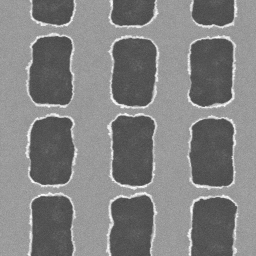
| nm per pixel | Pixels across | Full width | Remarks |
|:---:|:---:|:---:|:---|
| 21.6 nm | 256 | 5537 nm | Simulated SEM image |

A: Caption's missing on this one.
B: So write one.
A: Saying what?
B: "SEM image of holes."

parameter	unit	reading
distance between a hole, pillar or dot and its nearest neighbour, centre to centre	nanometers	1700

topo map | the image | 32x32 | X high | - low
XXXX-----XXXXX-----XXXXX-----XXX
XXXX-----XXXXX-----XXXXX-----XXX
XXXXX----XXXXX-----XXXXX-----XXX
XXXXXXXXXXXXXXXXXXXXXXXXXXXXXXXX
XXXXXXXXXXXXXXXXXXXXXXXXXXXXXXXX
XXXX-----XXXXX-----XXXXX-----XXX
XXXX-----XXXXX------XXXX-----XXX
XXXX-----XXXXX------XXXX-----XXX
XXXX-----XXXXX------XXXX-----XXX
XXXX-----XXXXX-----XXXXX-----XXX
XXX------XXXXX-----XXXXX-----XXX
XXXX-----XXXXX-----XXXXX-----XXX
XXXX-----XXXXX-----XXXXX-----XXX
XXXXXXXXXXXXXXXXXXXXXXXXXXXXXXXX
XXXXXX-XXXXXXXX-X-XXXXXXXXXXXXXX
XXXX-----XXXXX-----XXXXX-----XXX
XXXX-----XXXXX-----XXXXX-----XXX
XXXX-----XXXXX-----XXXXX-----XXX
XXXX-----XXXXX-----XXXXX-----XXX
XXXX-----XXXXX-----XXXXX-----XXX
XXXX-----XXXXX-----XXXXX-----XXX
XXXX-----XXXXX-----XXXXX-----XXX
XXXX-----XXXXX-----XXXXX-----XXX
XXXXXXXXXXXXXXXXXXXXXXXXXXXXXXXX
XXXXX---XXXXXXXXX-XXXXXXXXXXXXXX
XXXX-----XXXXX-----XXXXX-----XXX
XXXX-----XXXXX-----XXXXX------XX
XXXX-----XXXXX-----XXXXX-----XXX
XXXX-----XXXXX-----XXXXX-----XXX
XXXX-----XXXXX-----XXXXX-----XXX
XXXX-----XXXXX-----XXXXX-----XXX
XXXX-----XXXXX-----XXXXX-----XXX